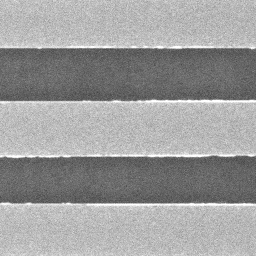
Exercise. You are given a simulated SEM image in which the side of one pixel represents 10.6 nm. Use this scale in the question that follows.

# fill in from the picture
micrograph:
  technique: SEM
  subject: lines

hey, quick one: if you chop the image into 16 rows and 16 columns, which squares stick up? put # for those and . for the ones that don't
################
################
################
................
................
................
################
################
################
################
................
................
................
################
################
################